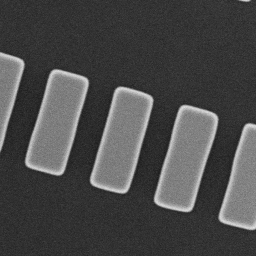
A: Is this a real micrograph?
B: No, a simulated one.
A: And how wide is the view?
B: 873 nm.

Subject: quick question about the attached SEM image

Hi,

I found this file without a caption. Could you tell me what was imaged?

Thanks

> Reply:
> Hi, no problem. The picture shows groups of lines, slits or small figures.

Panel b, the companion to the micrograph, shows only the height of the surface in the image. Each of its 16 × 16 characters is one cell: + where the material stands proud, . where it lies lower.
................
................
................
+...............
+..+............
+..++...........
+..++..++.......
+.+++..++..+++..
..+++.+++..++..+
..++..+++.+++..+
..++..++..+++..+
......++..++..++
..........++..++
..............++
................
................